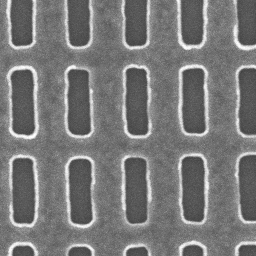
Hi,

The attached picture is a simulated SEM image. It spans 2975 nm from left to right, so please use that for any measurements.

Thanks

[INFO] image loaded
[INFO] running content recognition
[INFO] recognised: a regular array of holes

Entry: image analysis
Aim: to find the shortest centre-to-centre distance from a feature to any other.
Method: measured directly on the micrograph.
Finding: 655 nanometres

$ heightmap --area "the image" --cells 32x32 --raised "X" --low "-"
X---XXXX---XXXXX--XXXX---XXXXX--
X---XXXX---XXXX---XXXXX--XXXXX--
X---XXXX---XXXXX--XXXXX--XXXXX--
X---XXXXX--XXXXX--XXXXX--XXXXX--
X---XXXXX--XXXXX--XXXXX--XXXXX--
XX--XXXXX--XXXXX--XXXXX--XXXXX--
XXXXXXXXXXXXXXXXXXXXXXXXXXXXXXXX
XXXXXXXXXXXXXXXXXXXXXXXXXXXXXXXX
XXXXXXXXXXXXXXXX--XXXXXXXXXXXXX-
X---XXXX---XXXXX--XXXXX---XXXX--
X---XXXX---XXXXX--XXXXX---XXXX--
X---XXXX---XXXXX---XXXX---XXXX--
X---XXXX---XXXXX--XXXXX---XXXX--
X---XXXX---XXXXX--XXXXX---XXXX--
X---XXXX---XXXXX---XXXX---XXXX--
XX--XXXX---XXXXX---XXXX---XXXX--
XX--XXXXX--XXXXX---XXXX--XXXXX--
XXXXXXXXXXXXXXXXXXXXXXXXXXXXXXXX
XXXXXXXXXXXXXXXXXXXXXXXXXXXXXXXX
XXXXXXXXXXXXXXXXXXXXXXXXXXXXXXX-
XX--XXXXX--XXXXX--XXXXX--XXXXX--
XX--XXXXX--XXXXX--XXXXX---XXXX--
X---XXXXX---XXXX--XXXXX---XXXX--
X---XXXXX---XXXX--XXXXX---XXXX--
X----XXXX---XXXX---XXXX---XXXX--
X---XXXXX---XXXX---XXXX---XXXX--
XX--XXXXX---XXXX---XXXX---XXXX--
XX--XXXXX---XXXX--XXXXX--XXXXXX-
XXXXXXXXXXXXXXXXXXXXXXXXXXXXXXXX
XXXXXXXXXXXXXXXXXXXXXXXXXXXXXXXX
XXXXXXXXXXXXXXXXXXXXXXXXXXXXXXXX
XX--XXXXX--XXXXX--XXXXX--XXXXX--